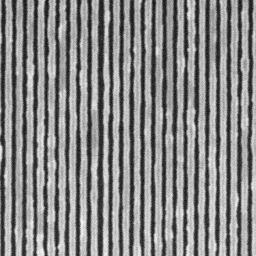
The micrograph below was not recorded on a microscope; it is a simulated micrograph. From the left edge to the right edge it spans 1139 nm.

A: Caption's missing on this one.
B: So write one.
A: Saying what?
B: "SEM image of parallel lines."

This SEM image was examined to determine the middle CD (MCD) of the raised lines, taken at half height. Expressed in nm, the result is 25.6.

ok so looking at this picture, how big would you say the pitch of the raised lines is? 0.0478 um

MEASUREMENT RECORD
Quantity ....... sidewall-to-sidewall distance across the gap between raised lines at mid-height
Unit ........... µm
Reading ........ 0.0217